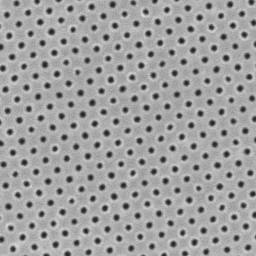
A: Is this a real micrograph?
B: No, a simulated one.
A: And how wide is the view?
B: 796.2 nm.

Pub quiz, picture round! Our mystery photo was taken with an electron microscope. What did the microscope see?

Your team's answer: a regular array of holes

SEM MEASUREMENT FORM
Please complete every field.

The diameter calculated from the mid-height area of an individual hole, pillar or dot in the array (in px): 6.4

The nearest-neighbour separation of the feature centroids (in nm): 45.8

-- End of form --